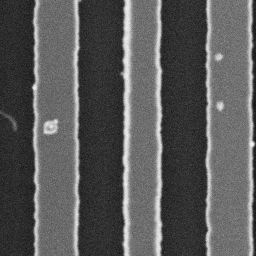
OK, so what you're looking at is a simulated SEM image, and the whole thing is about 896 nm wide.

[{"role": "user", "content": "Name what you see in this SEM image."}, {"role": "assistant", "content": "lines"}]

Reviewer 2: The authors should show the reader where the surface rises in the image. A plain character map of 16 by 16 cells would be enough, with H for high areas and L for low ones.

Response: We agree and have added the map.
LLHHHLLLHHLLLHHH
LLHHHLLLHHLLLHHH
LLHHHLLLHHLLLHHH
LLHHHLLLHHLLLHHH
LLHHHLLLHHLLLHHH
LLHHHLLLHHLLLHHH
LLHHHLLLHHLLLHHH
LLHHHLLLHHLLLHHH
LLHHHLLLHHLLLHHH
LLHHHLLLHHLLLHHH
LLHHHLLLHHLLLHHH
LLHHHLLLHHLLLHHH
LLHHHLLLHHLLLHHH
LLHHHLLLHHLLLHHH
LLHHHLLLHHLLLHHH
LLHHHLLLHHLLLHHH